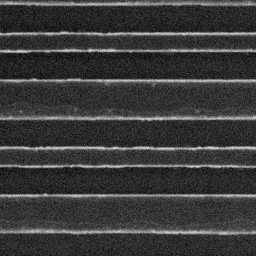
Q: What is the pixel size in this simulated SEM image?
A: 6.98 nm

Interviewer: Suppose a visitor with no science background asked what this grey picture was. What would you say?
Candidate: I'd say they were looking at lines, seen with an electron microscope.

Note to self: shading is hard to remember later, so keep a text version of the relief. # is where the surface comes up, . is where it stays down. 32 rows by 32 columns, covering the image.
................................
................................
................................
................................
################################
################################
................................
................................
................................
................................
################################
################################
################################
################################
################################
................................
................................
................................
####....####.....#......###.####
################################
################################
................................
................................
................................
################################
################################
################################
################################
################################
................................
................................
................................